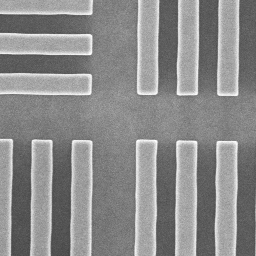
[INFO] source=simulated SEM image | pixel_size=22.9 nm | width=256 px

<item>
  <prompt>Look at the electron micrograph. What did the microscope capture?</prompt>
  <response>groups of lines, slits or small figures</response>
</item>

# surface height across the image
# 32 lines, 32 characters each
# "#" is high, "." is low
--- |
###########......###..###..###..
###########......###..###..###..
.................###..###..###..
.................###..###..###..
###########......###..###..###..
###########......###..###..###..
###########......###..###..###..
.................###..###..###..
.................###..###..###..
###########......###..###..###..
###########......###..###..###..
###########......###..###..###..
................................
................................
................................
................................
................................
#...............................
##..###..##......###..###..###..
##..###..##......###..###..###..
#...###..##......##...##...###..
#...###..##......##...##...###..
#...###..##......##...##...###..
#...##...##......###..##...###..
#...##...##......###..##...###..
#...##...##......###..##...##...
#...##...##......###..##...##...
#...##...##......###..##...##...
#...##...##......##...##...##...
#...##...##......##...##...##...
#...##...##......##...##...##...
#...##...##......##...##...##...